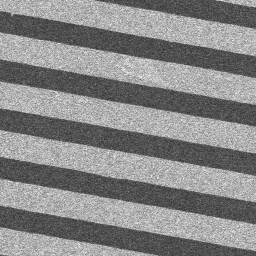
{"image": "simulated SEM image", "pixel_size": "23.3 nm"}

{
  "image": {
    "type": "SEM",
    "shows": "parallel lines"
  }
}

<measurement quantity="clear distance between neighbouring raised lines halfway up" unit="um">0.482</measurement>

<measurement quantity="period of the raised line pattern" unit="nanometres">1120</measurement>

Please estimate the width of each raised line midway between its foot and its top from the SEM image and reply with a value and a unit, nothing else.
628 nm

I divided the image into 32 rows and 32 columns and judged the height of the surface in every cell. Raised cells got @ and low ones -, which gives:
@@@@@@@@@@@@@@@--------------@@@
-@@@@@@@@@@@@@@@@@@@@-----------
------@@@@@@@@@@@@@@@@@@@-------
------------@@@@@@@@@@@@@@@@@@@@
@@@---------------@@@@@@@@@@@@@@
@@@@@@@@---------------@@@@@@@@@
@@@@@@@@@@@@@@---------------@@@
@@@@@@@@@@@@@@@@@@@@------------
-----@@@@@@@@@@@@@@@@@@@@-------
------------@@@@@@@@@@@@@@@@@@@-
@@---------------@@@@@@@@@@@@@@@
@@@@@@@@---------------@@@@@@@@@
@@@@@@@@@@@@@---------------@@@@
@@@@@@@@@@@@@@@@@@@-------------
-----@@@@@@@@@@@@@@@@@@@--------
-----------@@@@@@@@@@@@@@@@@@@--
@@--------------@@@@@@@@@@@@@@@@
@@@@@@@---------------@@@@@@@@@@
@@@@@@@@@@@@@---------------@@@@
@@@@@@@@@@@@@@@@@@--------------
-----@@@@@@@@@@@@@@@@@@@--------
-----------@@@@@@@@@@@@@@@@@@@--
@---------------@@@@@@@@@@@@@@@@
@@@@@@----------------@@@@@@@@@@
@@@@@@@@@@@@---------------@@@@@
@@@@@@@@@@@@@@@@@@--------------
----@@@@@@@@@@@@@@@@@@@---------
----------@@@@@@@@@@@@@@@@@@@---
---------------@@@@@@@@@@@@@@@@@
@@@@@@---------------@@@@@@@@@@@
@@@@@@@@@@@@---------------@@@@@
@@@@@@@@@@@@@@@@@---------------